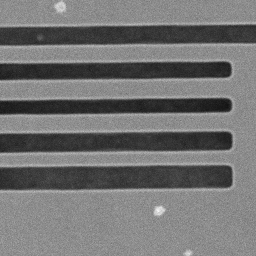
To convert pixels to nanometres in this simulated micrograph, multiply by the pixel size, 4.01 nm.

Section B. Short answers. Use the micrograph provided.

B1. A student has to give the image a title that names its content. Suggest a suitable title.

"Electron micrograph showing groups of lines, slits or small figures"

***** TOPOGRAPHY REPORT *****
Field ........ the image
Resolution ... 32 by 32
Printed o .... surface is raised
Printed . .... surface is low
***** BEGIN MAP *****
oooooooooooooooooooooooooooooooo
oooooooooooooooooooooooooooooooo
oooooooooooooooooooooooooooooooo
................................
................................
................................
oooooooooooooooooooooooooooooooo
oooooooooooooooooooooooooooooooo
.............................ooo
.............................ooo
oooooooooooooooooooooooooooooooo
oooooooooooooooooooooooooooooooo
.............................ooo
.............................ooo
oooooooooooooooooooooooooooooooo
oooooooooooooooooooooooooooooooo
oooooooooooo.................ooo
.............................ooo
.............................ooo
oooooooooooooooooooooooooooooooo
oooooooooooooooooooooooooooooooo
.............................ooo
.............................ooo
.............................ooo
oooooooooooooooooooooooooooooooo
oooooooooooooooooooooooooooooooo
oooooooooooooooooooooooooooooooo
oooooooooooooooooooooooooooooooo
oooooooooooooooooooooooooooooooo
oooooooooooooooooooooooooooooooo
oooooooooooooooooooooooooooooooo
oooooooooooooooooooooooooooooooo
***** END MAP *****